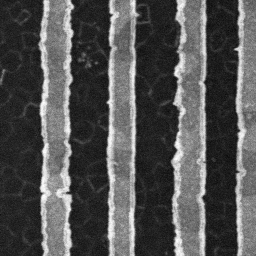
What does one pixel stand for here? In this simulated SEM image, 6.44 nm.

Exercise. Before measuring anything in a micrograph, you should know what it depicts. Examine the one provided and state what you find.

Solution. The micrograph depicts one or a few lines or trenches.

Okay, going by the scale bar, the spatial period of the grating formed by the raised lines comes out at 67.5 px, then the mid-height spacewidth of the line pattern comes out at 40.9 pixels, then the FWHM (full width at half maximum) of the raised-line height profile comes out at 0.159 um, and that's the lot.